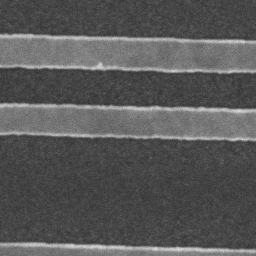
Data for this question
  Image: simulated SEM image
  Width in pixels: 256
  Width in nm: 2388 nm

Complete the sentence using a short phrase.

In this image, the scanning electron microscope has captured lines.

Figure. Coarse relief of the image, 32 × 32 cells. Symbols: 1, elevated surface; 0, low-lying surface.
00000000000000000000000000000000
00000000000000000000000000000000
00000000000000000000000000000000
00000000000000000000000000000000
11111000000000000000000000000000
11111111111111111111111111111111
11111111111111111111111111111111
11111111111111111111111111111111
00011111111111111111111111111111
00000000000000000000000000000000
00000000000000000000000000000000
00000000000000000000000000000000
00000000000000000000000000000000
11111111111111111111100000000000
11111111111111111111111111111111
11111111111111111111111111111111
11111111111111111111111111111111
00000000000000000000000000001111
00000000000000000000000000000000
00000000000000000000000000000000
00000000000000000000000000000000
00000000000000000000000000000000
00000000000000000000000000000000
00000000000000000000000000000000
00000000000000000000000000000000
00000000000000000000000000000000
00000000000000000000000000000000
00000000000000000000000000000000
00000000000000000000000000000000
00000000000000000000000000000000
10000000000000000000000000000000
11111111111111111111111111111111